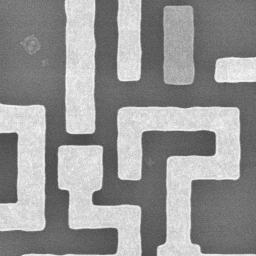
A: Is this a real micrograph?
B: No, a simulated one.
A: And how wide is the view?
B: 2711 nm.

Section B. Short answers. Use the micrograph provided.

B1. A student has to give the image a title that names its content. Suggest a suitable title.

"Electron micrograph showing wiring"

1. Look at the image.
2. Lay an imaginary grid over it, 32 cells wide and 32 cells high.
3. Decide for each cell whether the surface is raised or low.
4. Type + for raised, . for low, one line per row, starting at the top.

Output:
........++++...+++..............
........++++...+++...+++........
........++++...+++..++++........
........++++...+++..++++........
........++++...++....+++........
........++++...+++...+++........
........++++...+++...+++........
........++++...+++...+++...+++++
........++++...+++..++++...+++++
........++++...+++...+++...+++++
........++++..........+.........
........++++....................
........++++....................
+++++...++++....+.++++..+.++....
++++++..++++...+++++++++++++++..
++++++..++++...+++++++++++++++..
++++++...+++...+++.........+++..
..++++.........+++.........+++..
..++++..+++++..+++.........+++..
..++++.++++++..+++.....++.++++..
..++++.++++++..+++...+++++++++..
..++++.++++++..+++...+++++++++..
..++++.++++++........+++........
..+++...+++++........+++........
..++++...+++.........+++........
+++++....+++.........+++........
+++++....+++++++++...+++........
++++++...+++++++++...+++........
+++++....+....+++....+++........
...............+++...+++........
...............+++..++++........
...............+++..+++++.......